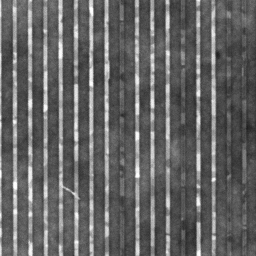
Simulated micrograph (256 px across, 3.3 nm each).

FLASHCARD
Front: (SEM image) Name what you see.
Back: parallel lines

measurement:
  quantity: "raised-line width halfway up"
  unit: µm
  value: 0.0078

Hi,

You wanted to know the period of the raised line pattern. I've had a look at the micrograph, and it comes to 0.0506 micrometres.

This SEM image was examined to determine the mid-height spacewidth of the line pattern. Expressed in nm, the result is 41.7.